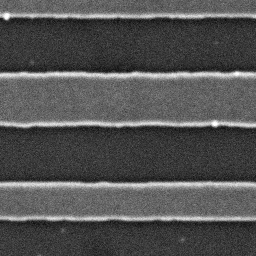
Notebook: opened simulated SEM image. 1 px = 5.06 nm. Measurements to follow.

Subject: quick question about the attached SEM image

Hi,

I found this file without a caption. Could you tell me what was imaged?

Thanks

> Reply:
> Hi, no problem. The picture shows lines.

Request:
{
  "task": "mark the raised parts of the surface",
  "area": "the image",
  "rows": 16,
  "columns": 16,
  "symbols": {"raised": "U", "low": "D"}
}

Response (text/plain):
UUUUUUUUUUUUUUUU
DDDDDDDDDDDDDDDD
DDDDDDDDDDDDDDDD
DDDDDDDDDDDDDDDD
DDDDDDDDDDDDDDDD
UUUUUUUUUUUUUUUU
UUUUUUUUUUUUUUUU
UUUUUUUUUUUUUUUU
DDDDDDDDDDDDDDDD
DDDDDDDDDDDDDDDD
DDDDDDDDDDDDDDDD
UUUUUUUUUUUUUUUU
UUUUUUUUUUUUUUUU
UUUUUUUUUUUUUUUU
DDDDDDDDDDDDDDDD
DDDDDDDDDDDDDDDD